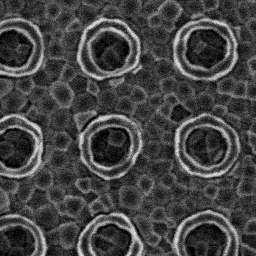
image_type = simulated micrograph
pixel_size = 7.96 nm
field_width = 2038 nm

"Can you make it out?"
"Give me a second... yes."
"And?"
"ring-shaped raised bodies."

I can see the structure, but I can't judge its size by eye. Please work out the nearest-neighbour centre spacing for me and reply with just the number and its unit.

763 nm